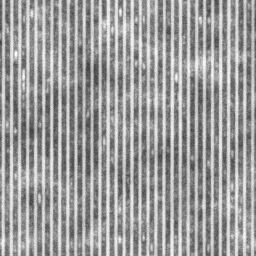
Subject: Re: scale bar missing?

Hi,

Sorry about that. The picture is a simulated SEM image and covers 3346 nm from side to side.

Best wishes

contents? parallel lines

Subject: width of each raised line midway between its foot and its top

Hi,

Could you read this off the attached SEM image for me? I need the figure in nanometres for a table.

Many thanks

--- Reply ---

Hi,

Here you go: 34.3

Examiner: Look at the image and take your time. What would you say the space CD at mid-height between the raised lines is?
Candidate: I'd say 0.0703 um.